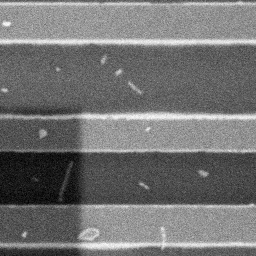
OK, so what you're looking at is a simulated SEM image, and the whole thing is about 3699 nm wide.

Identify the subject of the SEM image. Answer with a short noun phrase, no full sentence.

lines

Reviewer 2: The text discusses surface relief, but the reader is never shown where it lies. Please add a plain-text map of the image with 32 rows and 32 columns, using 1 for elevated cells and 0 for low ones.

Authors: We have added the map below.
11110001001000000100000100000110
11111111111111111111111111111111
11111111111111111111111111111111
11111111111111111111111111111111
11111111111111111111111111111111
00000000000000000000000000000000
00000000000000000000000000000000
00000000000000000000000000000000
00000000000000000000000000000000
00000000000000000000000000000000
00000000000000000000000000000000
00000000000000000000000000000000
00000000000000000000000000000000
00000000000000000000000000000000
00000000000000000000000000000000
11111111111111111111111111111111
11111111111111111111111111111111
11111111111111111111111111111111
11111111111111111111111111111111
00000000000000000000000000000000
00000000000000000000000000000000
00000000000000000000000000000000
00000000000000000000000000000000
00000000000000000000000000000000
00000000000000000000000000000000
00000000000000000000000000000000
11111111111111111111111111111111
11111111111111111111111111111111
11111111111111111111111111111111
11111111111111111111111111111111
00000000000000000000100000000000
00000000000000000000000000000000